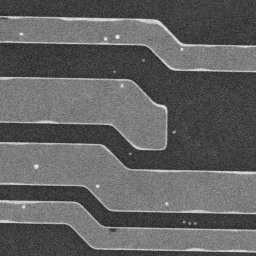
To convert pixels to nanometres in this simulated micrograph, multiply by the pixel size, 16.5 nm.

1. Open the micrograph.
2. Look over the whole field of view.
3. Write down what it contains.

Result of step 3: groups of lines, slits or small figures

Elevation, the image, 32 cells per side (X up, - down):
--------------------------------
--------------------------------
XXXXXXXXXXXXXXXXXX--------------
XXXXXXXXXXXXXXXXXXXXX-----------
XXXXXXXXXXXXXXXXXXXXXX----------
-------------XXXXXXXXXX---------
-------------------XXXXXXXXXXXXX
--------------------XXXXXXXXXXXX
---------------------XXXXXXXXXXX
--------------------------------
XXXXXXXXXXXXXXXXX---------------
XXXXXXXXXXXXXXXXXX--------------
XXXXXXXXXXXXXXXXXXX-------------
XXXXXXXXXXXXXXXXXXXXX-----------
XXXXXXXXXXXXXXXXXXXXX-----------
-------------XXXXXXXX-----------
---------------XXXXXX-----------
----------------XXXXX-----------
XXXXXXXXXXXXX----XXXX-----------
XXXXXXXXXXXXXX------------------
XXXXXXXXXXXXXXX-----------------
XXXXXXXXXXXXXXXXXXXXXXXXXXXX----
XXXXXXXXXXXXXXXXXXXXXXXXXXXXXXXX
-----------XXXXXXXXXXXXXXXXXXXXX
------------XXXXXXXXXXXXXXXXXXXX
XXXXXXXXXX---XXXXXXXXXXXXXXXXXXX
XXXXXXXXXXX--------XXXXX-XXXXXXX
XXXXXXXXXXXX--------------------
---------XXXXX------------------
----------XXXXXXXXXXXXXXXXXXXXXX
-----------XXXXXXXXXXXXXXXXXXXXX
--------------------------------